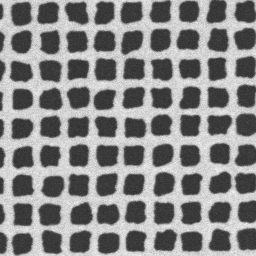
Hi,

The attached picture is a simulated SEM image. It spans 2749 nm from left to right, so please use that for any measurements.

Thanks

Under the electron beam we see a regular array of holes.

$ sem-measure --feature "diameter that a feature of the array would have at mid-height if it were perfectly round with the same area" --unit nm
240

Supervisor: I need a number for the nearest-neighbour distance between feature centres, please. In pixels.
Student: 27.1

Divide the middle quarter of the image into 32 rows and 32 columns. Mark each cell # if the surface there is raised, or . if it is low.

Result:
#.....##.....##.....##.....##...
#.....##.....##.....##.....##...
#.....##.....##.....##.....##...
#.....##.....##.....##.....##..#
################################
################################
#.....####...###....##.....###..
#.....##.....##.....##.....###..
#.....#......##.....##.....###..
#.....#.....###.....##.....##...
##....##....###....###.....##...
########...#####################
################################
##....##.....###..####.....##...
#.....##.....##.....##.....##...
#.....##.....##......#.....##...
#.....##.....##......#....###...
#.....###....##.....##....###...
#.##############################
################################
###...###....###...#####...##...
#.....##......#.....##......#...
#.....##.....##.....##.....##...
#.....##.....##.....##.....##...
#.....##.....##.....##.....##...
##...####...#####..####.######..
################################
##.#######...#####.####....#####
#.....##.....###....###....###..
#.....##.....##.....###.....#...
#.....##.....##.....##.....##...
#.....##.....##.....##.....##...